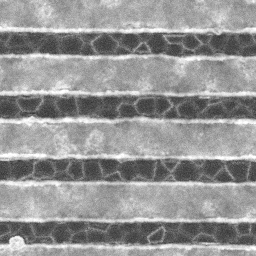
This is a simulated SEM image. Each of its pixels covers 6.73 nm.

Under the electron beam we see parallel lines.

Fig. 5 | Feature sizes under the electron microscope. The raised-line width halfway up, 248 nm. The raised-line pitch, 425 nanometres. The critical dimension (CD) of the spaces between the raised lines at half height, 0.172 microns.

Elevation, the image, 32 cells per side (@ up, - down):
@@@@@@@@@@@@@@@@@@@@@@@@@@@@@@@@
@@@@@@@@@@@@@@@@@@@@@@@@@@@@@@@@
@@@@@@@@@@@@@@@@@@@@@@@@@@@@@@@@
@@@@@@@@@@@@@@@@@@@@@@@@@@@@@@@@
--------------------------------
--------------------------------
--------------------------------
@@@@@@@@@@@@@@@@@@@@@@@@@@@@@@@@
@@@@@@@@@@@@@@@@@@@@@@@@@@@@@@@@
@@@@@@@@@@@@@@@@@@@@@@@@@@@@@@@@
@@@@@@@@@@@@@@@@@@@@@@@@@@@@@@@@
@@@@@@@@@@@@@@@@@@@@@@@@@@@@@@@@
--------------------------------
--------------------------------
--------------------------------
@@@@@@@@@@@@@@@@@@@@@@@@@@@@@@@@
@@@@@@@@@@@@@@@@@@@@@@@@@@@@@@@@
@@@@@@@@@@@@@@@@@@@@@@@@@@@@@@@@
@@@@@@@@@@@@@@@@@@@@@@@@@@@@@@@@
@@@@-@@@@@@@@@@@@@@@@@@@@@@@@@@@
--------------------------------
--------------------------------
--------------------------------
@@@@@@@@@@@@@@@@@@@@@@@@@@@@@@@@
@@@@@@@@@@@@@@@@@@@@@@@@@@@@@@@@
@@@@@@@@@@@@@@@@@@@@@@@@@@@@@@@@
@@@@@@@@@@@@@@@@@@@@@@@@@@@@@@@@
-----@----@@@@@@@@@@@@@@@@@@@@@@
--------------------------------
--------------------------------
-@@-----------------------------
@@@@@@@@@@@@@@@@@@@@@@@@@@@@@@@@